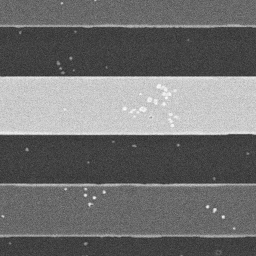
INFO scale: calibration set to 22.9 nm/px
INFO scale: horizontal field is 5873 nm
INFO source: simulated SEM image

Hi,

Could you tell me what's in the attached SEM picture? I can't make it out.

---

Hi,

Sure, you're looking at lines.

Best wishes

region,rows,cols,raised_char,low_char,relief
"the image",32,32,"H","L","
HHHHHHHHHHHHHHHHHHHHHHHHHHHHHHHH
HHHHHHHHHHHHHHHHHHHHHHHHHHHHHHHH
HHHHHHHHHHHHHHHHHHHHHHHHHHHHHHHH
LLLLLLLLLLLLLLLLLLLLLLLLLLLLLLLL
LLLLLLLLLLLLLLLLLLLLLLLLLLLLLLLL
LLLLLLLLLLLLLLLLLLLLLLLLLLLLLLLL
LLLLLLLLLLLLLLLLLLLLLLLLLLLLLLLL
LLLLLLLLLLLLLLLLLLLLLLLLLLLLLLLL
LLLLLLLLLLLLLLLLLLLLLLLLLLLLLLLL
LLLLLLLLLLLLLLLLLLLLLLLLLLLLLLLL
HHHHHHHHHHHHHHHHHHHHHHHHHHHHHHHH
HHHHHHHHHHHHHHHHHHHHHHHHHHHHHHHH
HHHHHHHHHHHHHHHHHHHHHHHHHHHHHHHH
HHHHHHHHHHHHHHHHHHHHHHHHHHHHHHHH
HHHHHHHHHHHHHHHHHHHHHHHHHHHHHHHH
HHHHHHHHHHHHHHHHHHHHHHHHHHHHHHHH
HHHHHHHHHHHHHHHHHHHHHHHHHHHHHHHH
LLLLLLLLLLLLLLLLLLLLLLLLLLLLLLLL
LLLLLLLLLLLLLLLLLLLLLLLLLLLLLLLL
LLLLLLLLLLLLLLLLLLLLLLLLLLLLLLLL
LLLLLLLLLLLLLLLLLLLLLLLLLLLLLLLL
LLLLLLLLLLLLLLLLLLLLLLLLLLLLLLLL
LLLLLLLLLLLLLLLLLLLLLLLLLLLLLLLL
HHHHHHHHHHHHHHHHHHHHHHHHHHHHHHHH
HHHHHHHHHHHHHHHHHHHHHHHHHHHHHHHH
HHHHHHHHHHHHHHHHHHHHHHHHHHHHHHHH
HHHHHHHHHHHHHHHHHHHHHHHHHHHHHHHH
HHHHHHHHHHHHHHHHHHHHHHHHHHHHHHHH
HHHHHHHHHHHHHHHHHHHHHHHHHHHHHHHH
LLLLLLLLLLLLLLLLLLLLLLLLLLHHHLLL
LLLLLLLLLLLLLLLLLLLLLLLLLLLLLLLL
LLLLLLLLLLLLLLLLLLLLLLLLLLLLLLLL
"